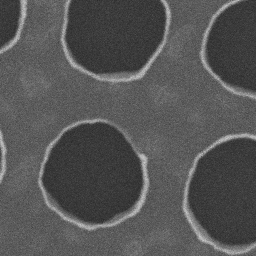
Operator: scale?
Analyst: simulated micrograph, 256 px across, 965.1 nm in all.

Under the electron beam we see holes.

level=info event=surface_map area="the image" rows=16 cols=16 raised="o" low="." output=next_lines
.ooo......oooo..
.ooo......ooo...
.ooo......ooo...
ooooo....oooo...
oooooo..ooooo...
ooooooooooooooo.
oooooooooooooooo
oooooooooooooooo
oooo....oooooooo
ooo.....ooooo...
ooo......ooo....
ooo......ooo....
ooo......ooo....
oooo...ooooo....
ooooooooooooo...
oooooooooooooooo